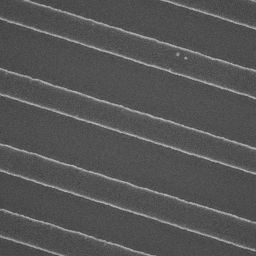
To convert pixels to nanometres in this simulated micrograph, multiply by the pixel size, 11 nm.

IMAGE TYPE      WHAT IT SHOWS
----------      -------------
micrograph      lines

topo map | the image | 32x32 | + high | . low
+++++.................++++++++++
++++++++.................+++++++
+++++++++++.................++++
....+++++++++++.................
.......+++++++++++..............
..........+++++++++++...........
.............+++++++++++........
.................+++++++++++....
....................+++++++++++.
+++....................+++++++++
++++++....................++++++
++++++++++...................+++
..++++++++++....................
.....+++++++++++................
.........++++++++++.............
............++++++++++..........
...............+++++++++++......
..................+++++++++++...
++...................+++++++++++
+++++...................++++++++
++++++++....................++++
+++++++++++....................+
....+++++++++++.................
.......+++++++++++..............
..........++++++++++++..........
.............+++++++++++........
+...............++++++++++++....
+++++...............+++++++++++.
++++++++...............+++++++++
+++++++++++...............++++++
...+++++++++++...............+++
......++++++++++++..............